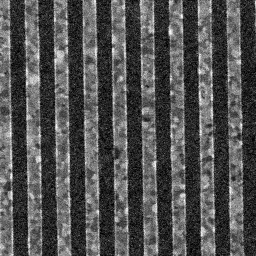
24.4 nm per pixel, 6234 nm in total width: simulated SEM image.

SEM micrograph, parallel lines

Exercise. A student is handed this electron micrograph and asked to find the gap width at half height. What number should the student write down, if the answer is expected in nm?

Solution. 386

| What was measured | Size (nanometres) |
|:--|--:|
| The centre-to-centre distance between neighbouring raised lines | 702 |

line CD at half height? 0.31 µm